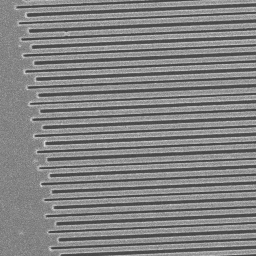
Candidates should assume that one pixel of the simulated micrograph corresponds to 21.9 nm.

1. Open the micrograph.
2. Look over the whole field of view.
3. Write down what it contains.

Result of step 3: parallel lines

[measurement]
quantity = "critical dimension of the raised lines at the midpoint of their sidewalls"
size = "106 nm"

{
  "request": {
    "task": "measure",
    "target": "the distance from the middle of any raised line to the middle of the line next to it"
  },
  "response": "176 nm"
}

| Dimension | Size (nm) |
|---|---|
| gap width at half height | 65.5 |